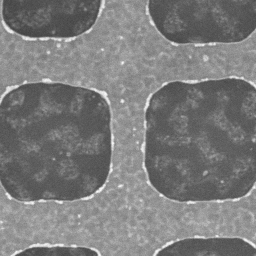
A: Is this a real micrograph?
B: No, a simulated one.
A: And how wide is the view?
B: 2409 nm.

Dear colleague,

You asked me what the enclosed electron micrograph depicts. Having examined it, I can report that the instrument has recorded holes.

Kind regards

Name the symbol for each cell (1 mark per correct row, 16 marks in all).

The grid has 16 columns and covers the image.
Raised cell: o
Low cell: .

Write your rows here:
......ooo.......
......oooo......
ooooooooooo....o
oooooooooooooooo
oooooooooooooooo
o....ooooo......
.......oo.......
.......oo.......
.......oo.......
.......oo.......
.......oo.......
......oooo......
o.o..oooooo...oo
oooooooooooooooo
oooooooooooooooo
oo...ooooo......